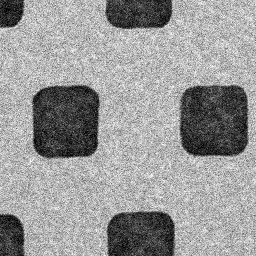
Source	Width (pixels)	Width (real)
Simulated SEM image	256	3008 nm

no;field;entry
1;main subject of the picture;holes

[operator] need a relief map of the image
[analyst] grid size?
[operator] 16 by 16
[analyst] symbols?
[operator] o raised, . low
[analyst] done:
.oooooo....ooooo
.oooooo...oooooo
oooooooooooooooo
oooooooooooooooo
oooooooooooooooo
ooo...oooooo...o
oo....ooooo....o
oo....ooooo....o
oo....ooooo.....
oo....oooooo...o
oooooooooooooooo
oooooooooooooooo
oooooooooooooooo
.oooooo....ooooo
..ooooo....ooooo
..ooooo....ooooo